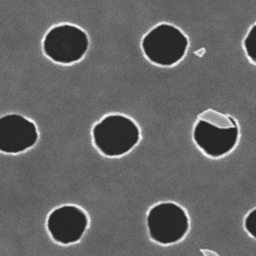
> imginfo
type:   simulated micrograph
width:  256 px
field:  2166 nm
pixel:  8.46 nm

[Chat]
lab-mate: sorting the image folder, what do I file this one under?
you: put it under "holes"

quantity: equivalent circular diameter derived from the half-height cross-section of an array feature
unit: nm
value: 344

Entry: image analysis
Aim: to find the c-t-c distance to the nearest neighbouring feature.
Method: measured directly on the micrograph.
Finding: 0.841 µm